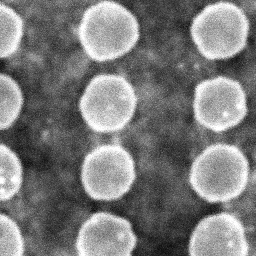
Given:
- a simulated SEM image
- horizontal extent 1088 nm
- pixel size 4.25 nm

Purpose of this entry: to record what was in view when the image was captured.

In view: raised bodies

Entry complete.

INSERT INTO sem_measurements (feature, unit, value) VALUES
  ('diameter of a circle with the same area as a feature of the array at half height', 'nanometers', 230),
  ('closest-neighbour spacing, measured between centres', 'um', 0.297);